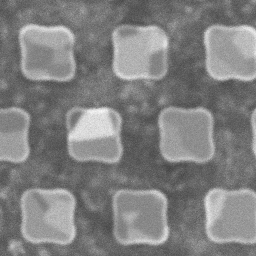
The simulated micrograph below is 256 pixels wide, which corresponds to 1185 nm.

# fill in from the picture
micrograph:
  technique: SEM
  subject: raised bodies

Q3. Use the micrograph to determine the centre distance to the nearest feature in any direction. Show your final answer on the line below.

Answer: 426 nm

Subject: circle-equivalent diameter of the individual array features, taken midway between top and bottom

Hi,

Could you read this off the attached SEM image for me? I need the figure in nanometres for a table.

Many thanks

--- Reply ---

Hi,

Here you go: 265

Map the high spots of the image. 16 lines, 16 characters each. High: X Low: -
----------------
----------------
-XXXX--XXX---XXX
-XXXX--XXX---XXX
--XXX--XXX---XXX
----------------
----------------
XX--XXX---XXX---
XX--XXX---XXX---
XX--XXXX--XXX---
----------------
----------------
-XXXX--XXX---XXX
-XXXX--XXX---XXX
--XXX--XXX---XXX
----------------